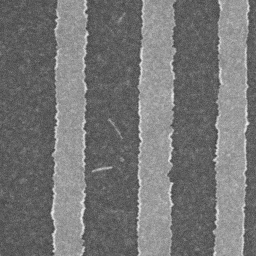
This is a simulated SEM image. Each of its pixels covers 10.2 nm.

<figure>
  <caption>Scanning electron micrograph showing one or a few lines or trenches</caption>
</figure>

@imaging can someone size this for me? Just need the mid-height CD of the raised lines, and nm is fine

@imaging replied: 296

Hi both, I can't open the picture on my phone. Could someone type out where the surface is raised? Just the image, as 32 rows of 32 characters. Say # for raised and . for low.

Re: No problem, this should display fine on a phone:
.......####.......####.....####.
.......####.......####......###.
.......####.......####.....####.
.......####.......####.....####.
.......####.......###......####.
.......####.......####.....####.
.......####.......####.....####.
.......####.......####.....####.
.......####.......####.....####.
.......####.......####.....####.
.......####......#####......###.
.......####......#####.....####.
.......####......#####.....####.
.......####......#####.....####.
.......####......#####.....####.
.......####......####......####.
.......####......#####.....####.
.......####.......###......####.
.......####......####......####.
.......####......####......####.
.......####......####......####.
.......####......####......####.
.......####......####......####.
.......####......####......####.
.......####......####......####.
.......###.......####......####.
......####.......####......###..
.......###.......####......###..
.......###.......####......###..
.......###.......####......###..
.......###.......####......###..
.......###.......####......###..